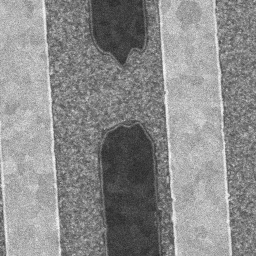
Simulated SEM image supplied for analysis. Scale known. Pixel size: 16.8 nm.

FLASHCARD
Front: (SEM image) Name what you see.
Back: one or a few lines or trenches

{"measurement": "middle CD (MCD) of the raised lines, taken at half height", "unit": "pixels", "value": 53.9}